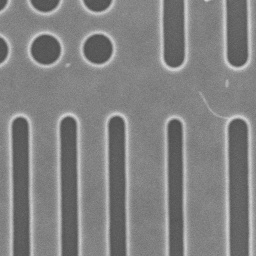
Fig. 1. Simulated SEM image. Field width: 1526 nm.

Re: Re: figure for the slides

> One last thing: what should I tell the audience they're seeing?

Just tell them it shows groups of lines, slits or small figures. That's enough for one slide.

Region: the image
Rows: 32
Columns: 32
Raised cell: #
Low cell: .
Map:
.###...###....######...#####...#
#####.######.#######...#####...#
####################...#####...#
####################...#####...#
#####..####..#######...#####...#
.###....##....######...#####...#
.###....##....######...#####...#
.###...####...######...#####...#
#####################.##########
################################
################################
################################
################################
################################
##############.#################
#...###...####..#####..######..#
#...###...###...#####..#####...#
#...###...###...#####..#####...#
#...###...###...#####..#####...#
#...###...###...#####..#####...#
#...###...###...#####..#####...#
#...###...###...#####..#####...#
#...###...###...#####..#####...#
#...###...####..#####..#####...#
#...###...####..#####..######..#
#...###...####..#####..######..#
#...###...####..#####..######..#
#...###...####..#####..######..#
#...###...####..#####..######..#
#...###...####..#####..######..#
#...####..####..#####..######..#
#...####..####..#####..######..#